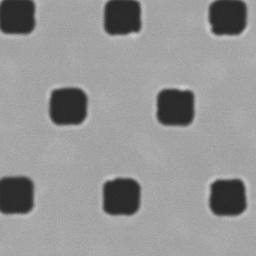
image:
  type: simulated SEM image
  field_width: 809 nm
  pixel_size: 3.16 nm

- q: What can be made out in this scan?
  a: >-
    holes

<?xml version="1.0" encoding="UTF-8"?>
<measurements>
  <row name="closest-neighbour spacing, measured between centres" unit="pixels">105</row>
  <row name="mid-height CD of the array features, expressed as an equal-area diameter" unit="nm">125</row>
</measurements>